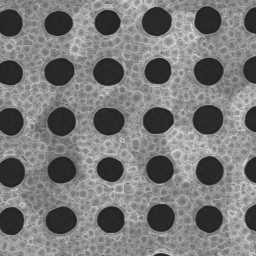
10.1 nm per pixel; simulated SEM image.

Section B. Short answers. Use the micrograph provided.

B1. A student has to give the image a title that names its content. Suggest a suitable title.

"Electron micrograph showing a regular array of holes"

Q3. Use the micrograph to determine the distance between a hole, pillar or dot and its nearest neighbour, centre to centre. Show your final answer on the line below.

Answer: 490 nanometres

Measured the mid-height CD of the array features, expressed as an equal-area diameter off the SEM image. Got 28 pixels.